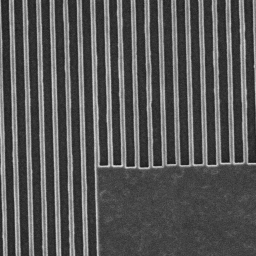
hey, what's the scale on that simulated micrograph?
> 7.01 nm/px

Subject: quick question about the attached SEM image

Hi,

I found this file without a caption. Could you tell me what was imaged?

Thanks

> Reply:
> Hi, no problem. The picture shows parallel lines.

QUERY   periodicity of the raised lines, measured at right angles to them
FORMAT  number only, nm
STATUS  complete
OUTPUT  94.4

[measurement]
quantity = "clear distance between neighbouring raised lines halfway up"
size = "67.4 nanometers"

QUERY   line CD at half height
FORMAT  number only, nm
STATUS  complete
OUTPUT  30.6